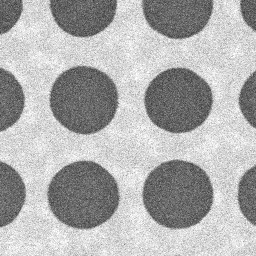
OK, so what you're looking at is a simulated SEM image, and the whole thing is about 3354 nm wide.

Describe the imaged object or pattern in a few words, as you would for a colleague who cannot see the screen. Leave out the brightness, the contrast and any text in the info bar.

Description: holes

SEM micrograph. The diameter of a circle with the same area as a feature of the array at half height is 905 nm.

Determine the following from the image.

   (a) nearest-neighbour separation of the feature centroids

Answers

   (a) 1240 nanometers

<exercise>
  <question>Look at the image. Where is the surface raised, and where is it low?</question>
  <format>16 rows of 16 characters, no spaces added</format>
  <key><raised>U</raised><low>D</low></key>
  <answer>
DUUDDDDUUDDDDUUD
DUUUDDDUUDDDDUUD
UUUUUUUUUUUUUUUU
UUUUUUUUUUUUUUUU
UUUUDDUUUUDDUUUU
DUUDDDDUUDDDDUUD
DUUDDDDUUDDDDUUD
DUUUDDDUUDDDDUUD
UUUUUUUUUUUUUUUU
UUUUUUUUUUUUUUUU
DUUUDDUUUUDDDUUU
DUUDDDDUUDDDDUUD
DDUDDDDUUDDDDUUD
DUUDDDDUUDDDDUUD
UUUUUUUUUUUUUUUU
UUUUUUUUUUUUUUUU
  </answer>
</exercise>